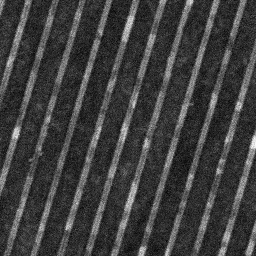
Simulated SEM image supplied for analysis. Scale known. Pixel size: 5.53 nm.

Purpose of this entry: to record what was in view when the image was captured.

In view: parallel lines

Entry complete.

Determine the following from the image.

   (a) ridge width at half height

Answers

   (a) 24.5 nm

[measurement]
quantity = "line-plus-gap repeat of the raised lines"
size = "25.7 pixels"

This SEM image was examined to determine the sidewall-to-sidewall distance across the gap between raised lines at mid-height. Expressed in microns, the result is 0.117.